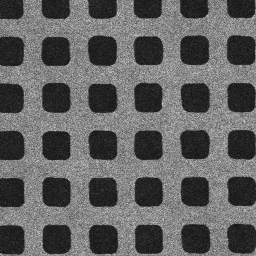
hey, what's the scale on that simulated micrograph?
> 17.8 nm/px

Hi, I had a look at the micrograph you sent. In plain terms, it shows a regular array of holes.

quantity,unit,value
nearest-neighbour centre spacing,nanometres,819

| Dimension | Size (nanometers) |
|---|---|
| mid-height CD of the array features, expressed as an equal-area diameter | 559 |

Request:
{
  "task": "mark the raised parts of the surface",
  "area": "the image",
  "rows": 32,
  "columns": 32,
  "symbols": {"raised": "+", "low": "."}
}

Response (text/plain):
...++....++....++...++....++....
...++....++....++...+++...++....
++++++++++++++++++++++++++++++++
++++++++++++++++++++++++++++++++
++++++++++++.++++++++++..++++..+
...++....++....++...+++...++....
...++....++....++...++....++....
...++....++....++...+++...+++...
++++++++++++++++++++++++++++++++
++++++++++++++++++++++++++++++++
..++++..++++..+++...+++...+++..+
...++....++....++...+++...++....
...++....++....++...+++...++....
...++....++...+++...+++...+++...
++++++++++++++++++++++++++++++++
++++++++++++++++++++++++++++++++
..++++..++++..+++...+++...+++..+
...++....++....++...+++...++....
...++....++....++...+++...++....
...++....++....++...+++...+++...
++++++++++++++++++++++++++++++++
++++++++++++++++++++++++++++++++
...+++..+++...+++...+++...+++...
...++....++....++...+++...++....
...++....++....++...+++...+++...
...+++...++....++...+++...+++...
++++++++++++++++++++++++++++++++
++++++++++++++++++++++++++++++++
...+++...++...+++...+++...+++...
...++....++....++...+++...++....
...++....++....++...+++...++....
...+++..++++..+++...+++...+++..+